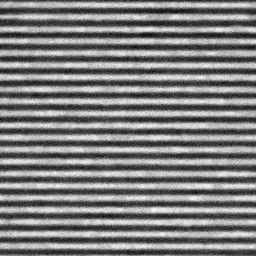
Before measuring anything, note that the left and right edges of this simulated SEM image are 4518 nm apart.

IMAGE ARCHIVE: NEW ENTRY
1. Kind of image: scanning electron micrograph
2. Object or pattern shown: parallel lines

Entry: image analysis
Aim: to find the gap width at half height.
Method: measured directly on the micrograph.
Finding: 152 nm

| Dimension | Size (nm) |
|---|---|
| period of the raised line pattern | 213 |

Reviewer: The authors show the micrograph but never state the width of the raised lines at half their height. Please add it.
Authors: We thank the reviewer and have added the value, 61.8 nm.